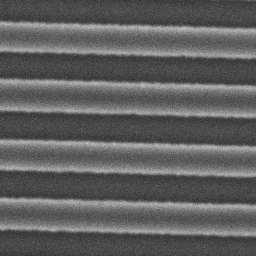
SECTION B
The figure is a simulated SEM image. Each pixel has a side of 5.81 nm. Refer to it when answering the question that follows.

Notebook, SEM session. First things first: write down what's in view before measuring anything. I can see lines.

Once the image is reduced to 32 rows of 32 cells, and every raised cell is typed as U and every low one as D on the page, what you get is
DDDDDDDDDDDDDDDDDDDDDDDDDDDDDDDD
DDDDDDDDDDDDDDDDDDDDDDDDDDDDDDDD
DDDDDDDDDDDDDDDDDDDDDDDDDDDDDDDD
UUUUUUUUUUUUUUUUUUUUUUUUUUDDDDDD
UUUUUUUUUUUUUUUUUUUUUUUUUUUUUUUU
UUUUUUUUUUUUUUUUUUUUUUUUUUUUUUUU
DDDDDDDUUUUUUUUUUUUUUUUUUUUUUUUU
DDDDDDDDDDDDDDDDDDDDDDDDDDDDDDDD
DDDDDDDDDDDDDDDDDDDDDDDDDDDDDDDD
DDDDDDDDDDDDDDDDDDDDDDDDDDDDDDDD
UUUUUUUUUUUUUUUUUUUUDDDDDDDDDDDD
UUUUUUUUUUUUUUUUUUUUUUUUUUUUUUUU
UUUUUUUUUUUUUUUUUUUUUUUUUUUUUUUU
UUUUUUUUUUUUUUUUUUUUUUUUUUUUUUUU
DDDDDDDDDDDDDDDDDDDDDDDDDDDDUUUU
DDDDDDDDDDDDDDDDDDDDDDDDDDDDDDDD
DDDDDDDDDDDDDDDDDDDDDDDDDDDDDDDD
DDDDDDDDDDDDDDDDDDDDDDDDDDDDDDDD
UUUUUUUUUUUUUUUUUUUUUUUUUUUUUUUU
UUUUUUUUUUUUUUUUUUUUUUUUUUUUUUUU
UUUUUUUUUUUUUUUUUUUUUUUUUUUUUUUU
DDDDDDDDDDDDUUUUUUUUUUUUUUUUUUUU
DDDDDDDDDDDDDDDDDDDDDDDDDDDDDDDD
DDDDDDDDDDDDDDDDDDDDDDDDDDDDDDDD
DDDDDDDDDDDDDDDDDDDDDDDDDDDDDDDD
UUUUUUUUUUUUUUUUUUUUUUDDDDDDDDDD
UUUUUUUUUUUUUUUUUUUUUUUUUUUUUUUU
UUUUUUUUUUUUUUUUUUUUUUUUUUUUUUUU
UUUUUUUUUUUUUUUUUUUUUUUUUUUUUUUU
DDDDDDDDDDDDDDDDDDDDDDDDDDDDDDDD
DDDDDDDDDDDDDDDDDDDDDDDDDDDDDDDD
DDDDDDDDDDDDDDDDDDDDDDDDDDDDDDDD